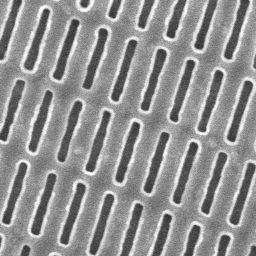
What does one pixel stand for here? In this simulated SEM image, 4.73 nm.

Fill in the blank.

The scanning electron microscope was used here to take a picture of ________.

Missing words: a regular array of holes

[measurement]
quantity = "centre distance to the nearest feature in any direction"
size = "0.144 µm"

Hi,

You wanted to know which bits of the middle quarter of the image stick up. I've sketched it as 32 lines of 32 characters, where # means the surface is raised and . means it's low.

######...#####...#####...#####..
######..######..######..######..
#####...######..######..######..
#####...#####...#####...#####...
#####..######..######..######...
#####..#####...######..######..#
############...#####...#####...#
############..######...#####..##
############..######..######..##
##...###############..#####...##
##...##############...#####...##
##..######.########..######..###
#...######..##############...###
#...######..##############...###
#..######..######..########.####
...######..######..#############
...#####...#####...#############
..######...#####...#####..######
..#####...#####...######..######
..#####...#####...#####...######
.######...#####...#####...#####.
.######..######..######..######.
.#####...#####...######..#####..
.#####..######...#####...#####..
######..######...#####...#####..
#####...######..#####...######..
#####...#####...#####...#####...
#############..######...#####..#
#############..######..######..#
#############..#####...#####...#
###..###############..######..##
###..###############..######..##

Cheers